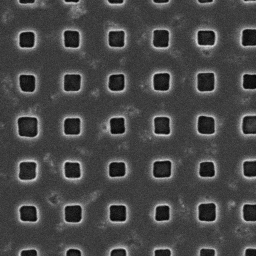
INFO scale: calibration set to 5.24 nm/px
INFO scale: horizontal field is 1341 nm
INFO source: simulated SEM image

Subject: a regular array of holes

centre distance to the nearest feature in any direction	227	nm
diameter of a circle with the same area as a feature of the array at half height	97.6	nm